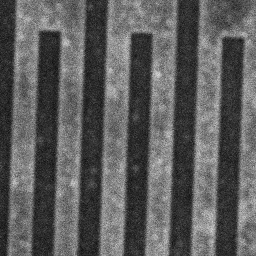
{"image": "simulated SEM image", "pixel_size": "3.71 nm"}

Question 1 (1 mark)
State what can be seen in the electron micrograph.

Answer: parallel lines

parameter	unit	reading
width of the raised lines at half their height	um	0.0801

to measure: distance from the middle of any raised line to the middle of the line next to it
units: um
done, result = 0.169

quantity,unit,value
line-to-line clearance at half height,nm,87.1